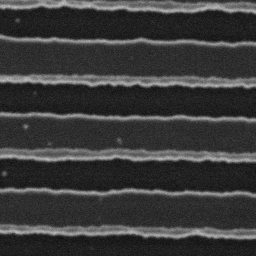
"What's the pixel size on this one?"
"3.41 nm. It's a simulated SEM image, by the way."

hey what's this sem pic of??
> lines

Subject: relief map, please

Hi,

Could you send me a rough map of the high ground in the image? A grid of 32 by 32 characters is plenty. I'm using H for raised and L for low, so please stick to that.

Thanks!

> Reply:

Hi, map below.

HHHHHHHHHHHHHHHHHHHHHHHHHHHHHHHH
LLLLLLLLLLLLLLLLLLLLLLLLLLLLLLLL
LLLLLLLLLLLLLLLLLLLLLLLLLLLLLLLL
LLLLLLLLLLLLLLLLLLLLLLLLLLLLLLLL
LLLLLLLLLLLLLLLLLLLLLLLLLLLLLLLL
HHHHHHHHHHHHHHHHHHHHHHHHHHHHHHHH
HHHHHHHHHHHHHHHHHHHHHHHHHHHHHHHH
HHHHHHHHHHHHHHHHHHHHHHHHHHHHHHHH
HHHHHHHHHHHHHHHHHHHHHHHHHHHHHHHH
HHHHHHHHHHHHHHHHHHHHHHHHHHHHHHHH
LLLLLLLLLLLHHLHHHHHHHHHHHHHHHHHH
LLLLLLLLLLLLLLLLLLLLLLLLLLLLLLLL
LLLLLLLLLLLLLLLLLLLLLLLLLLLLLLLL
LLLLLLLLLLLLLLLLLLLLLLLLLLLLLLLL
HHHHHHHLHHHLLLLLLLLLLLLLLLLLLLLL
HHHHHHHHHHHHHHHHHHHHHHHHHHHHHHHH
HHHHHHHHHHHHHHHHHHHHHHHHHHHHHHHH
HHHHHHHHHHHHHHHHHHHHHHHHHHHHHHHH
HHHHHHHHHHHHHHHHHHHHHHHHHHHHHHHH
HHHHHHHHHHHHHHHHHHHHHHHHHHHHHHHH
LLLLLLLLLLLLLLLLLLLLLLLLLLLLLLLL
LLLLLLLLLLLLLLLLLLLLLLLLLLLLLLLL
LLLLLLLLLLLLLLLLLLLLLLLLLLLLLLLL
LLLLLLLLLLLLLLLLLLLLLLLLLLLLLLLL
HHHHHHHHHHHHHHHHHHHHHHHHHHHHHHHH
HHHHHHHHHHHHHHHHHHHHHHHHHHHHHHHH
HHHHHHHHHHHHHHHHHHHHHHHHHHHHHHHH
HHHHHHHHHHHHHHHHHHHHHHHHHHHHHHHH
HHHHHHHHHHHHHHHHHHHHHHHHHHHHHHHH
LLLLLLLLLLLLLLLLLLLLHHHLLLHHHHHH
LLLLLLLLLLLLLLLLLLLLLLLLLLLLLLLL
LLLLLLLLLLLLLLLLLLLLLLLLLLLLLLLL